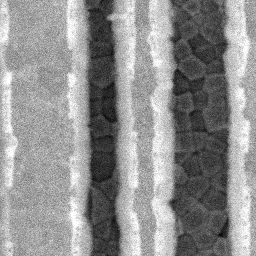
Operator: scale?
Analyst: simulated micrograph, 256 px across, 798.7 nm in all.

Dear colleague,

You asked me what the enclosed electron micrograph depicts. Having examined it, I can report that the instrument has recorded one or a few lines or trenches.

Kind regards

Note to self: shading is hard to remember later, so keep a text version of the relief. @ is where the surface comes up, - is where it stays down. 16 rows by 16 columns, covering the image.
@@@@@---@@-----@
@@@@@---@@-----@
@@@@@---@@-----@
@@@@@---@@-----@
@@@@@---@@-----@
@@@@@---@@-----@
@@@@@---@@-----@
@@@@@---@@-----@
@@@@@---@@-----@
@@@@@---@@-----@
@@@@@---@@-----@
@@@@@---@@-----@
@@@@@---@@-----@
@@@@@---@@-----@
@@@@@---@@-----@
@@@@@---@@-----@